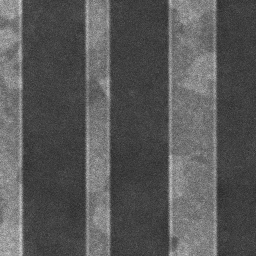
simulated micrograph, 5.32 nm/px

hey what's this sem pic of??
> one or a few lines or trenches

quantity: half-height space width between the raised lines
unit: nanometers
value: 342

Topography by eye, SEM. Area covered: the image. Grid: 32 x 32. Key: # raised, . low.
##.........##........######.....
##.........##........######.....
##.........##........######.....
##.........##........######.....
##.........##........######.....
##.........##........######.....
##.........##........######.....
##.........##........######.....
##.........##........######.....
##.........##........######.....
##.........##........######.....
##.........##........######.....
##.........##........######.....
##.........##........######.....
##.........##........######.....
##.........##........######.....
##.........##........######.....
##.........##........######.....
##.........##........######.....
##.........##........######.....
###........##........######.....
###........##........######.....
###........##........######.....
###........##........######.....
###........###.......######.....
###........###.......######.....
###........###.......######.....
###........###.......######.....
###........###.......######.....
###........###.......######.....
###........###.......######.....
###........###.......######.....